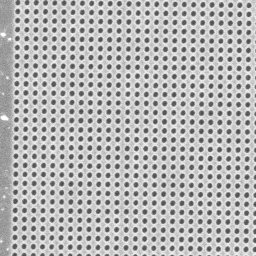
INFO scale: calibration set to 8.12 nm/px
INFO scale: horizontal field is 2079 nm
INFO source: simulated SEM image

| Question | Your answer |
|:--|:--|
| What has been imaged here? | a regular array of holes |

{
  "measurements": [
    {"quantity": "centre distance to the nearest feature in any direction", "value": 71.8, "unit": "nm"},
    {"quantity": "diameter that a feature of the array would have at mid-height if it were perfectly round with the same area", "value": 47.6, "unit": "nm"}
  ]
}